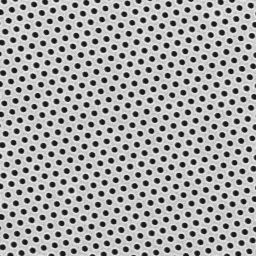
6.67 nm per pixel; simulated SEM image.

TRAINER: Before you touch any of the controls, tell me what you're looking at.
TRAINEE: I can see a regular array of holes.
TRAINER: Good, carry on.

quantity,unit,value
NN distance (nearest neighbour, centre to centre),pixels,11.2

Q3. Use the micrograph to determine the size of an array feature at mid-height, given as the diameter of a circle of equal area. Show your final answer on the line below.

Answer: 38.4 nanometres